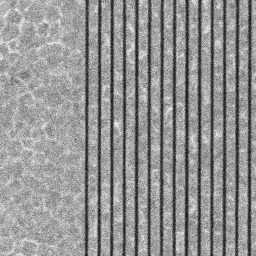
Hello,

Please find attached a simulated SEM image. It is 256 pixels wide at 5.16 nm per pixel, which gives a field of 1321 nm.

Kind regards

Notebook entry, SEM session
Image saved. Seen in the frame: parallel lines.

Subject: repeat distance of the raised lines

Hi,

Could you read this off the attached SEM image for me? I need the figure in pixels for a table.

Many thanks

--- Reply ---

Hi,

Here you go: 12.5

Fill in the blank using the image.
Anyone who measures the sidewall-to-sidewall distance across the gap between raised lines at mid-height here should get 18.1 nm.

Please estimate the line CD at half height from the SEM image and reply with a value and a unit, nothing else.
0.0458 µm